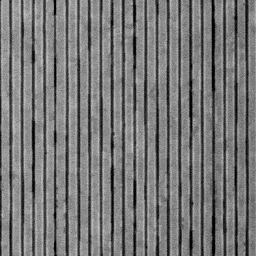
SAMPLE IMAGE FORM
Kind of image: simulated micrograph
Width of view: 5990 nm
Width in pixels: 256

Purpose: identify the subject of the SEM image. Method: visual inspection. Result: parallel lines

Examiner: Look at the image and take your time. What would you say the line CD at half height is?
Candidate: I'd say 170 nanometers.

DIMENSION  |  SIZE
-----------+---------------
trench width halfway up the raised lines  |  3.62 pixels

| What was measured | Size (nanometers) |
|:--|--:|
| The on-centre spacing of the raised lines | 263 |